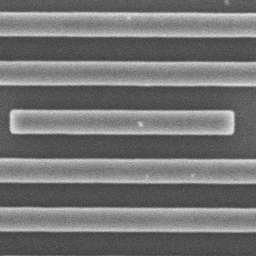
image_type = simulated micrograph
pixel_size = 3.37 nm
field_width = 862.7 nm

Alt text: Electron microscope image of groups of lines, slits or small figures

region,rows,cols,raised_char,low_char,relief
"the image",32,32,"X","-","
--------------------------------
--------------------------------
XXXXXXXXXXXXXXXXXXXXXXXXXXXXXXXX
XXXXXXXXXXXXXXXXXXXXXXXXXXXXXXXX
--------------------XX-XXXXXXX-X
--------------------------------
--------------------------------
--------------------------------
XXXXXXXXXXXXXXXXXXXXXXXXXXXXXXXX
XXXXXXXXXXXXXXXXXXXXXXXXXXXXXXXX
-XXXXXXXXXXX-XXXXXXXXXXXXXXXXXXX
--------------------------------
--------------------------------
--------------------------------
-XXXXXXXXXXXXXXXXXXXXXXXXXXXX---
-XXXXXXXXXXXXXXXXXXXXXXXXXXXX---
--XXXXXXXXXXXXXXXXXXXXXXXXXXX---
--------------------------------
--------------------------------
--------------------------------
XXXXXXXXXXXXXXXXXXXXXXXXXXXXXXXX
XXXXXXXXXXXXXXXXXXXXXXXXXXXXXXXX
XXXXXXXXXXXXXXXXXXXXXXXXXXXXXXXX
--------------------------------
--------------------------------
--------------------------------
XXXXXXXXXXXXXXXXXXXXXXXXXXXXXXXX
XXXXXXXXXXXXXXXXXXXXXXXXXXXXXXXX
XXXXXXXXXXXXXXXXXXXXXXXXXXXXXXXX
--------------------------------
--------------------------------
--------------------------------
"